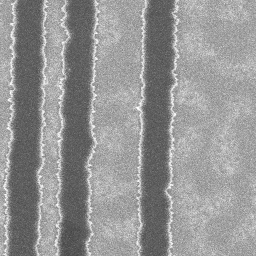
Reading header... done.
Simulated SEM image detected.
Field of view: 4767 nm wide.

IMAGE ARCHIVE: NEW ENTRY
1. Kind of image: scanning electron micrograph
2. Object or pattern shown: one or a few lines or trenches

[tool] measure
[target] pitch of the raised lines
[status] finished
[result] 1210 nanometers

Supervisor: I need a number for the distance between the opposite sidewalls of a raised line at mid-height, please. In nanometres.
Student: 609